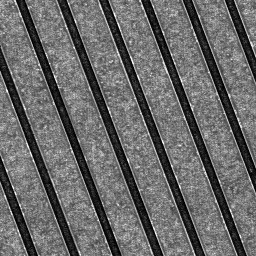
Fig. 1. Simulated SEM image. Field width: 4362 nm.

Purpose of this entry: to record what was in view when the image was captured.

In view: parallel lines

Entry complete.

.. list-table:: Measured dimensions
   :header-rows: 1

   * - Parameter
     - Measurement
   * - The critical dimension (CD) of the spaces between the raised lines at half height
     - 161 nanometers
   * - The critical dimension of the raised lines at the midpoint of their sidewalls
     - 504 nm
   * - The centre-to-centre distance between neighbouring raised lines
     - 666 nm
